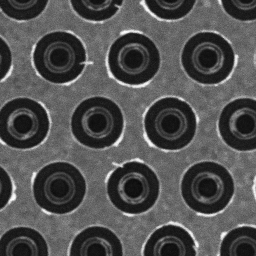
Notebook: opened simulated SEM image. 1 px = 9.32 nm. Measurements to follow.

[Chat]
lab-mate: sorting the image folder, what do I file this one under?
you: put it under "a regular array of ring-shaped grooves with a dot in the middle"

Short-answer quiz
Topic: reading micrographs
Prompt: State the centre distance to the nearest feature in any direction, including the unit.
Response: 686 nm